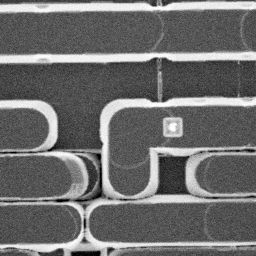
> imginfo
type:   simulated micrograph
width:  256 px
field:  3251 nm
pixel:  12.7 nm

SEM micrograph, wiring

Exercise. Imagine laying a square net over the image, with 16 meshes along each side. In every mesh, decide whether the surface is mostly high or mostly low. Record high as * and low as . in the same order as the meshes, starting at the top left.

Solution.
......*.********
****************
****************
*********..*....
................
................
........********
***....*********
***....*********
***....***..****
*****..***..****
*****..***..****
*****..*********
****************
****************
**......********